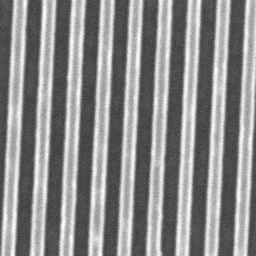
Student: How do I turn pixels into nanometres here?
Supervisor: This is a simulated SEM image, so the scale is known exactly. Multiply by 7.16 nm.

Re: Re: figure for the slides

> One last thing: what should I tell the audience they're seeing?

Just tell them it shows parallel lines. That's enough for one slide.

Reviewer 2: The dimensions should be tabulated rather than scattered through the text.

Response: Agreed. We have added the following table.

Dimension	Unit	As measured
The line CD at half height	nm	83.1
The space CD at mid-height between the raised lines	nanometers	126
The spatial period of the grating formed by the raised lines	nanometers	208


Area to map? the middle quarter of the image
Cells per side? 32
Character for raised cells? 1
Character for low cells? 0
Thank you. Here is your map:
01110000011000001110000111000001
01110000011000001110000111000011
01110000011000001100000111000011
01110000011000001100000111000011
01110000011000001100000111000011
01110000111000001100000111000011
01110000111000001100000111000011
01110000111000001100000111000011
01110000111000001100000111000011
01110000111000001100000110000011
01110000111000001100000110000011
01110000111000001100000110000011
01110000111000011100000110000011
01100000111000011100000110000011
01110000111000011100001110000011
01100000111000011100001110000011
01100000111000011100001110000011
01100000111000011100001110000011
01100000111000011100001110000011
11100000111000011100001110000011
11100000110000011100001110000011
11100000110000011100001110000111
11100000110000011000001110000011
11100000110000011000001110000111
11100000110000011000001110000011
11100000110000011000001110000111
11100001110000011000001110000111
11100001110000011000001110000111
11100001110000011000001110000111
11100001110000011000001100000111
11100001110000111000001100000111
11100001110000111000001100000111